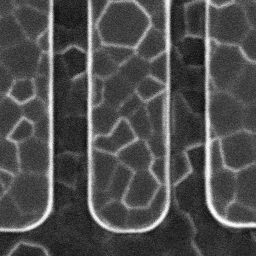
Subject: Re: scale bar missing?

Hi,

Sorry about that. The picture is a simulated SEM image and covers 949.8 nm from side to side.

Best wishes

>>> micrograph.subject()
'one or a few lines or trenches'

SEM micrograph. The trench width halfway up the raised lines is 140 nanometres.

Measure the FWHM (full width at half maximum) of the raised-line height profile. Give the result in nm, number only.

295